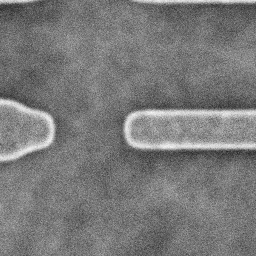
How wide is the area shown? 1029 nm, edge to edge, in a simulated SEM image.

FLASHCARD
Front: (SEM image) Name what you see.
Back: wiring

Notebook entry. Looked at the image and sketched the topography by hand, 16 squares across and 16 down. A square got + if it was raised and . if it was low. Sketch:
................
................
................
................
................
................
+...............
+++.....++++++++
+++.....++++++++
++..............
................
................
................
................
................
................